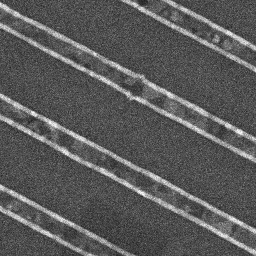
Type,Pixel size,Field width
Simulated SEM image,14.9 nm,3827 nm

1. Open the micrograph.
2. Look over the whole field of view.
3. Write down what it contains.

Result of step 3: one or a few lines or trenches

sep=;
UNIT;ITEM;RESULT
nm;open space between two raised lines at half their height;921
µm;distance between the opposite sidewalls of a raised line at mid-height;0.287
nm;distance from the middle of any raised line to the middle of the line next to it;1210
